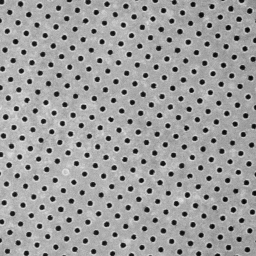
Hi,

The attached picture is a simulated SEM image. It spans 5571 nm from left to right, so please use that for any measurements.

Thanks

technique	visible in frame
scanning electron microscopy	a regular array of holes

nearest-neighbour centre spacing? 0.286 microns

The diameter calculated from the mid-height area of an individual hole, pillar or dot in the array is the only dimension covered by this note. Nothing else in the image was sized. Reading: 0.125 µm